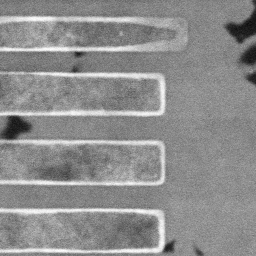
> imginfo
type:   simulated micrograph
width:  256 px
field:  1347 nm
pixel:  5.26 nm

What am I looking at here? wiring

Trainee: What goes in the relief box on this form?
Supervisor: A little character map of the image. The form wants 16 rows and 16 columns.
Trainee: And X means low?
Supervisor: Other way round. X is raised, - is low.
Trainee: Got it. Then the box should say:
----------------
XXXXXXXXXXX-----
XXXXXXXXXXX-----
----------------
----------------
XXXXXXXXXX------
XXXXXXXXXX------
----------------
----------------
XXXXXXXXXX------
XXXXXXXXXX------
----------------
----------------
XXXXXXXXXX------
XXXXXXXXXX------
XXXXXXXXXX------